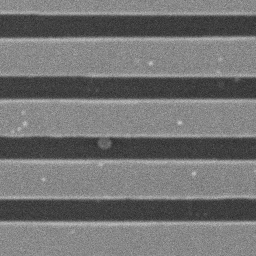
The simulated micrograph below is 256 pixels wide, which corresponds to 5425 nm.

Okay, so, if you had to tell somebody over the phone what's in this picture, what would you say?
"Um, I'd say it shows lines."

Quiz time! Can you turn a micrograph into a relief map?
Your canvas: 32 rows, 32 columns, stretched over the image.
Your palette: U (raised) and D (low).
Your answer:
UUUUUUUUUUUUUUUUUUUUUUUUUUUUUUUU
UUUUUUUUUUUUUUUUUUUUUUUUUUUUUUUU
DDDDDDDDDDDDDDDDDDDDDDDDDDDDDDDD
DDDDDDDDDDDDDDDDDDDDDDDDDDDDDDDD
DDDDDDDDDDDDDDDDDDDDDDDDDDDDDDDD
UUUUUUUUUUUUUUUUUUUUUUUUUUUUUUUU
UUUUUUUUUUUUUUUUUUUUUUUUUUUUUUUU
UUUUUUUUUUUUUUUUUUUUUUUUUUUUUUUU
UUUUUUUUUUUUUUUUUUUUUUUUUUUUUUUU
DDDUUDDDDDUUUUUUUUUUUUUUUUUUUUUU
DDDDDDDDDDDDDDDDDDDDDDDDDDDDDDDD
DDDDDDDDDDDDDDDDDDDDDDDDDDDDDDDD
DDDDUUUUUUDDDDDDDDDDDDDDUUUUUUUU
UUUUUUUUUUUUUUUUUUUUUUUUUUUUUUUU
UUUUUUUUUUUUUUUUUUUUUUUUUUUUUUUU
UUUUUUUUUUUUUUUUUUUUUUUUUUUUUUUU
UUUUUUUUUUUUUUUUUUUUUUUUUUUUUUUU
DDDDDDDDDDDDDDDDDDDDDDDDDDDDDDDD
DDDDDDDDDDDDDDDDDDDDDDDDDDDDDDDD
DDDDDDDDDDDDDDDDDDDDDDDDDDDDDDDD
UUUUUUUUUUUUUUUUUUUUUUUUUUUUUUUU
UUUUUUUUUUUUUUUUUUUUUUUUUUUUUUUU
UUUUUUUUUUUUUUUUUUUUUUUUUUUUUUUU
UUUUUUUUUUUUUUUUUUUUUUUUUUUUUUUU
UUUUUUUUUUUUUUUUUUUUUUUUUUUUUUUU
DDDDDDDDDDDDDDDDDDDDDDDDDDDDDDDD
DDDDDDDDDDDDDDDDDDDDDDDDDDDDDDDD
DDDDDDDDDDDDDDDDDDDDDDDDDDDDDDDD
UUUUUUUUUUUUUUUUUUUUUUUUUUUUUUUU
UUUUUUUUUUUUUUUUUUUUUUUUUUUUUUUU
UUUUUUUUUUUUUUUUUUUUUUUUUUUUUUUU
UUUUUUUUUUUUUUUUUUUUUUUUUUUUUUUU